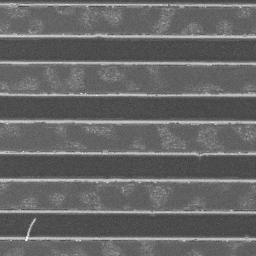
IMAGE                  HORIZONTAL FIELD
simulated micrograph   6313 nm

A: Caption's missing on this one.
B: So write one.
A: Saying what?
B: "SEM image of parallel lines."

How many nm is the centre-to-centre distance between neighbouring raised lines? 1440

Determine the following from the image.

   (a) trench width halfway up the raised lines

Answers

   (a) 660 nanometres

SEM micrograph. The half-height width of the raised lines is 777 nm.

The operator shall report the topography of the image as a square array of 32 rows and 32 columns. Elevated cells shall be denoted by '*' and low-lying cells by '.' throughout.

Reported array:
................................
********************************
********************************
********************************
.......*****.*******************
................................
................................
................................
********************************
********************************
********************************
********************************
................................
................................
................................
********************************
********************************
********************************
********************************
................................
................................
................................
................................
********************************
********************************
********************************
................****............
................................
................................
................................
********************************
********************************